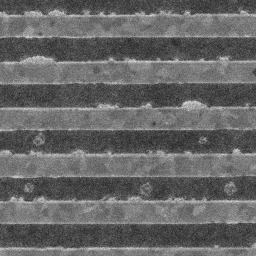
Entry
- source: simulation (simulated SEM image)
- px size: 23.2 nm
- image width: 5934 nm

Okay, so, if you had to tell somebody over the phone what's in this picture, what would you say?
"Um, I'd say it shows lines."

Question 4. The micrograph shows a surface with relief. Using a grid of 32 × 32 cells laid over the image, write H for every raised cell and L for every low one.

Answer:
LLLLLLLLLLLLLLLLLLLLLLLLLLLLLLLL
LLLLLLLLLLLLLLLLLLLLLLLLLLLLLLLL
HHHHHHHHHHHHHHHHHHHHHHHHHHHHHHHH
HHHHHHHHHHHHHHHHHHHHHHHHHHHHHHHH
HHHHHHHHHHHHHHHHHHHHHHHHHHHHHHHH
LLLLLLLLLLLLLLLLLLLLLLLLLLLLLLLL
LLLLLLLLLLLLLLLLLLLLLLLLLLLLLLLL
LLLHHHLLLLLLLLLLLLLLLLLLLLLHHLLL
HHHHHHHHHHHHHHHHHHHHHHHHHHHHHHHH
HHHHHHHHHHHHHHHHHHHHHHHHHHHHHHHH
LLLLLLLLLLLLLLLLLLLLLLLLLLLLLLLL
LLLLLLLLLLLLLLLLLLLLLLLLLLLLLLLL
LLLLLLLLLLLLLLLLLLLLLLLLLLLLLLLL
LLLLLLLLLLLLHHHLLLHLLLHHHHLHHHHH
HHHHHHHHHHHHHHHHHHHHHHHHHHHHHHHH
HHHHHHHHHHHHHHHHHHHHHHHHHHHHHHHH
LLLLLLLLLLLLLLLLLLLLLLLLLLLLLLLL
LLLLLLLLLLLLLLLLLLLLLLLLLLLLLLLL
LLLLLLLLLLLLLLLLLLLLLLLLLLLLLLLL
HHHHHHHHHHHHHHHHHHHHHHHHHHHHHHHH
HHHHHHHHHHHHHHHHHHHHHHHHHHHHHHHH
HHHHHHHHHHHHHHHHHHHHHHHHHHHHHHHH
LLLLLLLLLLLLLLLLLLLLLLLLLLLLLLLL
LLLLLLLLLLLLLLLLLLLLLLLLLLLLLLLL
LLLLLLLLLLLLLLLLLLLLLLLLLLLLLLLL
HHHHHHHHHHHHHHHHHHHHHHHHHHHHHHHH
HHHHHHHHHHHHHHHHHHHHHHHHHHHHHHHH
HHHHHHHHHHHHHHHHHHHHHHHHHHHHHHHH
LLLLLLLLLLLLLLLLLLLLLLLLLLLLLLLL
LLLLLLLLLLLLLLLLLLLLLLLLLLLLLLLL
LLLLLLLLLLLLLLLLLLLLLLLLLLLLLLLL
HHHHHHHHHHHHHHHHHHHHHHHHHHHHHHHH